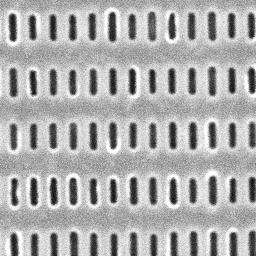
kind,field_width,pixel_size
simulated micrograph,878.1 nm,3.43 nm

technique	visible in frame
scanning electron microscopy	a regular array of holes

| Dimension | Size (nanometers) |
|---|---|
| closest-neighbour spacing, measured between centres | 67.3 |